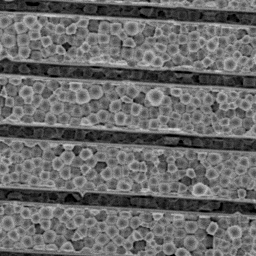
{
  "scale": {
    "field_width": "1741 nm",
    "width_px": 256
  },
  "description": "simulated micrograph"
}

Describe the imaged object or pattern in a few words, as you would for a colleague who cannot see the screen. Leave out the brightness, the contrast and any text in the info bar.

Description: parallel lines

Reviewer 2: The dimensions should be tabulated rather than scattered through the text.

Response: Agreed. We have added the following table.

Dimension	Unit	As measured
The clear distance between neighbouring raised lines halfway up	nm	93.3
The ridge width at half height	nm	338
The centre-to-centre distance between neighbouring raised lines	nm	430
